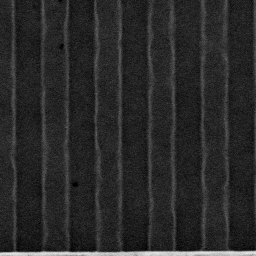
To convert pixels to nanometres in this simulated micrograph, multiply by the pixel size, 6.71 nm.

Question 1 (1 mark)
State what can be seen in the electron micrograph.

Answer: wiring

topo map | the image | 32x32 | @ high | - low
@@---@@@----@@@----@@@---@@@----
@@---@@@----@@@----@@@---@@@----
@@---@@@----@@@----@@@---@@@----
@@---@@@----@@@----@@@---@@@----
@@---@@@----@@@----@@@---@@@----
@@---@@@----@@@----@@@---@@@----
@@---@@@----@@@----@@@---@@@----
@@---@@@----@@@----@@@---@@@----
@@---@@@----@@@----@@@---@@@----
@@---@@@----@@@----@@@---@@@----
@@---@@@----@@@----@@@---@@@----
@@---@@@----@@@----@@@---@@@----
@@---@@@----@@@----@@@---@@@----
@@---@@@----@@@----@@@---@@@----
@@---@@@----@@@----@@@---@@@----
@@---@@@----@@@----@@@---@@@----
@@---@@@----@@@----@@@---@@@----
@@---@@@----@@@----@@@---@@@----
@@----@@----@@@----@@@---@@@----
@@----@@----@@@----@@@---@@@----
@@----@@----@@@----@@@---@@@----
@@---@@@----@@@----@@@---@@@@---
@@---@@@----@@@----@@@---@@@@---
@@---@@@----@@@----@@@---@@@----
@@---@@@----@@@----@@@----@@----
@@---@@@----@@@----@@@---@@@----
@@---@@@----@@@----@@@---@@@----
@@---@@@----@@@----@@@---@@@----
@@----@@----@@@----@@@---@@@----
@@----@@@---@@@----@@@---@@@----
@@---@@@@---@@@----@@@---@@@----
@@---@@@@---@@@@--@@@@--@@@@@-@@